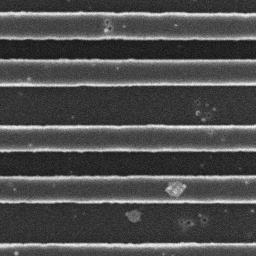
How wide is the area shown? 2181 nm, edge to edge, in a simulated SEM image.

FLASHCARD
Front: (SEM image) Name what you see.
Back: lines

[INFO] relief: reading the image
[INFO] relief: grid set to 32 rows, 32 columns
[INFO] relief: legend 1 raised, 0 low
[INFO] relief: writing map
00000000000000000000000000000000
00100000000000000000000000000000
11111111111111111111111111111111
11111111111111111111111111111111
11111111111111111111111111111111
00000000000000000000000000000000
00000000000000000000000000000000
00000000000000001000000000000000
11111111111111111111111111111111
11111111111111111111111111111111
11111111111111111111111111111111
00000000000000000000000000000000
00000000000000000000000000000000
00000000000000000000000000000000
00000000000000000000000000000000
00000000000000000000000000000000
11111111111111111111111111111111
11111111111111111111111111111111
11111111111111111111111111111111
00000000000000000000000000000000
00000000000000000000000000000000
00000000000000000000000000000000
11111111111111111111111111111111
11111111111111111111111111111111
11111111111111111111111111111111
00000000000000000000000000000000
00000000000000000000000000000000
00000000000000000000000000000000
00000000000000000000000000000000
00000000000000000000000000000000
01111111111111100010111111111111
11111111111111111111111111111111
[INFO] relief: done